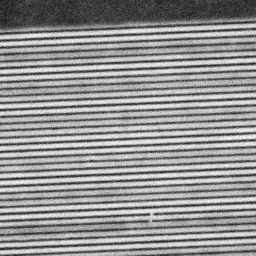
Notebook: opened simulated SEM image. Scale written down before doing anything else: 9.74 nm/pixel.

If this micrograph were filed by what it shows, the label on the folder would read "parallel lines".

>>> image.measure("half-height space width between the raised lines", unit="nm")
25.5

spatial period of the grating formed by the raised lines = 67.6 nm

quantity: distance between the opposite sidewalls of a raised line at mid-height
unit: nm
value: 43.8